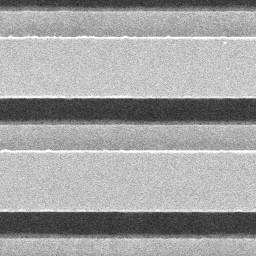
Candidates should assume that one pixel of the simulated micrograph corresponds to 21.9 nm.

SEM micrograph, lines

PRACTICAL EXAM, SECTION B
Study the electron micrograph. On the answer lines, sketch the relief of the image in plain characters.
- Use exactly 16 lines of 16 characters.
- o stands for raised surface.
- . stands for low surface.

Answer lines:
................
oooooooooooooooo
oooooooooooooooo
oooooooooooooooo
oooooooooooooooo
oooooooooooooooo
................
................
oooooooooooooooo
oooooooooooooooo
oooooooooooooooo
oooooooooooooooo
oooooooooooooooo
................
................
oooooooooooooooo